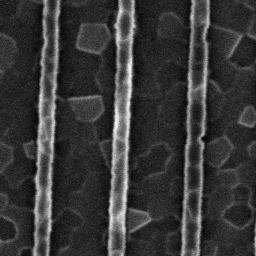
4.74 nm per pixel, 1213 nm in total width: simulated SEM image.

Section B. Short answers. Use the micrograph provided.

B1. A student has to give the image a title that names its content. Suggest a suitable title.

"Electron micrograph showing one or a few lines or trenches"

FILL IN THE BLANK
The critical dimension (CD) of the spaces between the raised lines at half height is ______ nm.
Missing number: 282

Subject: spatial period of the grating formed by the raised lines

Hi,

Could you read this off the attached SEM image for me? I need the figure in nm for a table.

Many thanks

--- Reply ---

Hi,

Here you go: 353